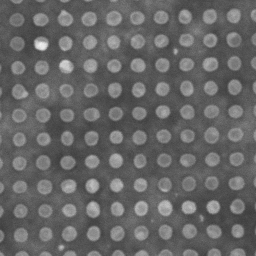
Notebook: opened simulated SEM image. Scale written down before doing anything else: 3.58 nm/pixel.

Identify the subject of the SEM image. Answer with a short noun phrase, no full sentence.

a regular array of raised bodies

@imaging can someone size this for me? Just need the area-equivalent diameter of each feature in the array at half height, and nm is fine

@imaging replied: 47.9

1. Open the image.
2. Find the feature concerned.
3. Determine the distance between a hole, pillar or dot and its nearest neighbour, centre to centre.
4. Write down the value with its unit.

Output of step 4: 0.0835 micrometres